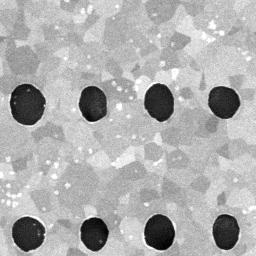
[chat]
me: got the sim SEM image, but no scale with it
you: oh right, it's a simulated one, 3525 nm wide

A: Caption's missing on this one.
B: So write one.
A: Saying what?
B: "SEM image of a regular array of holes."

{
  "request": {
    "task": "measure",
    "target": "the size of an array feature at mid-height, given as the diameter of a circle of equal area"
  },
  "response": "33.4 pixels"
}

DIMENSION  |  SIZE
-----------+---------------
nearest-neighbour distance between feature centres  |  898 nanometers